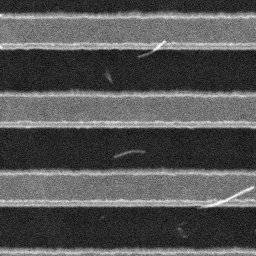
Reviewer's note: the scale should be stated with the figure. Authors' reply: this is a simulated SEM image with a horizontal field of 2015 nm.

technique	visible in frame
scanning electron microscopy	lines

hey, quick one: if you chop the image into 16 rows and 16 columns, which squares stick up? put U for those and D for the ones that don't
DDDDDDDDDDDDDDDD
UUUUUUUUUUUUUUUU
UUUUUUUUUUUUUUUU
DDDDDDDDDDDDDDDD
DDDDDDDDDDDDDDDD
DDDDDDDDDDDDDDDD
UUUUUUUUUUUUUUUU
UUUUUUUUUUUUUUUU
DDDDDDDDDDDDDDDD
DDDDDDDDDDDDDDDD
DDDDDDDDDDDDDDDD
UUUUUUUUUUUUUUUU
UUUUUUUUUUUUUUUU
DDDDDDDDDDDDDDDD
DDDDDDDDDDDDDDDD
DDDDDDDDDDDDDDDD